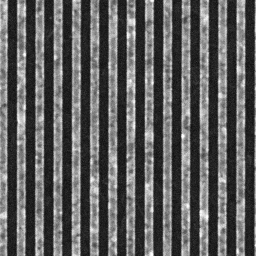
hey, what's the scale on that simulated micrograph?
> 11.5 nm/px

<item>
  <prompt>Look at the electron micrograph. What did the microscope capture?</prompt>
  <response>parallel lines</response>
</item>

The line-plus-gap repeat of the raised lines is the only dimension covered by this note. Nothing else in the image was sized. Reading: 210 nm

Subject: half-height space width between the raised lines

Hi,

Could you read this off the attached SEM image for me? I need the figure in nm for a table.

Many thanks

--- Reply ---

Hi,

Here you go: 129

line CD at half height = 81.7 nm